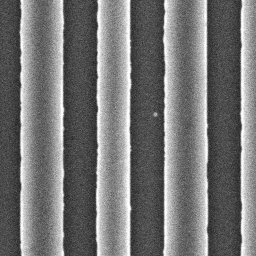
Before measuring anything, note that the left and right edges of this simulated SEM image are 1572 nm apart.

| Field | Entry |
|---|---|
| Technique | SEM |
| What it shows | lines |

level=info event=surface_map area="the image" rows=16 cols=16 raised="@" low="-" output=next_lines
-@@@--@@--@@@--@
-@@@--@@--@@@--@
-@@@--@@--@@@--@
-@@@--@@--@@@--@
-@@@--@@--@@@--@
-@@@--@@--@@@--@
-@@@--@@--@@@--@
-@@@--@@--@@@--@
-@@@--@@--@@@--@
-@@@--@@--@@@--@
-@@@--@@--@@@--@
-@@@--@@--@@@--@
-@@@--@@--@@@--@
-@@@--@@--@@@--@
-@@@--@@--@@@--@
-@@@--@@--@@@--@